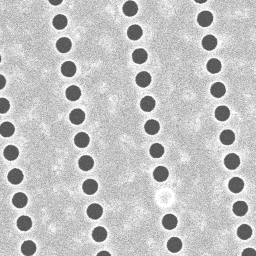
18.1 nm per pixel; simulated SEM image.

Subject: a regular array of holes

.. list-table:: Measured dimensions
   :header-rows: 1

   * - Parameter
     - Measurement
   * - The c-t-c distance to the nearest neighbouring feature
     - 428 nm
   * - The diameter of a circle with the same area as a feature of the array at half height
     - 299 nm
